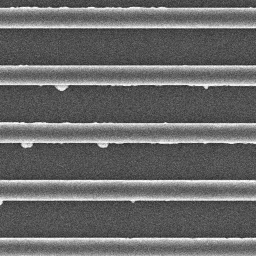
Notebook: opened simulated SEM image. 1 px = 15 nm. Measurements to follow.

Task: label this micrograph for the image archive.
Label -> lines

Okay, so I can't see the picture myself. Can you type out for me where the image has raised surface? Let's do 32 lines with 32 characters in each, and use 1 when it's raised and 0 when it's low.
00000000000000000000000000000000
11111111111111111111111111111111
11111111111111111111111111111111
00000000000000000000000000000000
00000000000000000000000000000000
00000000000000000000000000000000
00000000000000000000000000000000
00000000000000000000000000000000
11111111111111111111111111111111
11111111111111111111111111111111
11111111111111111111111111111111
00000000000000000000000000000000
00000000000000000000000000000000
00000000000000000000000000000000
00000000000000000000000000000000
11111111111111111111111111111111
11111111111111111111111111111111
11111111111111111111111111111111
00000000000000000000000000000000
00000000000000000000000000000000
00000000000000000000000000000000
00000000000000000000000000000000
00000000000000000000000000000000
11111111111111111111111111111111
11111111111111111111111111111111
00000000000000000000000000000000
00000000000000000000000000000000
00000000000000000000000000000000
00000000000000000000000000000000
00000000000000000000000000000000
11111111111111111111111111111111
11111111111111111111111111111111